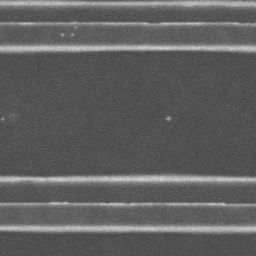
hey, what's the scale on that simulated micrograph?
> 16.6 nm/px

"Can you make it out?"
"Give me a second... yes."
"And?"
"lines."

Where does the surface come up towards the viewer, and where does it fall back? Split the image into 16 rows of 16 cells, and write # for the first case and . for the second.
################
################
################
................
................
................
................
................
................
................
................
################
################
################
................
................